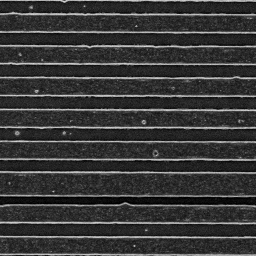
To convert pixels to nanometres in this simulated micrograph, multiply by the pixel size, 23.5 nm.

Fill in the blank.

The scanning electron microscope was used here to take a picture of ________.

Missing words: parallel lines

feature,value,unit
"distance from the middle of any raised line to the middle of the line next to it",748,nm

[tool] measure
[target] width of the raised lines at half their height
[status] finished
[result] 18.1 px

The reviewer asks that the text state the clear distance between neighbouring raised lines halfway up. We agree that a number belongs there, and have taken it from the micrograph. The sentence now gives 323 nm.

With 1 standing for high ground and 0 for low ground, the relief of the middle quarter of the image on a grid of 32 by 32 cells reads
00000000000000000000000000000000
00000000000000000000000000000000
00000000000000000000000000000000
00000000000000000000000000000000
11111111111111111111111111111111
11111111111111111111111111111111
11111111111111111111111111111111
11111111111111111111111111111111
00000000000000000000000000000000
00000000000000000000000000000000
00000000000000000000000000000000
00000000000000000000000000000000
11111111111111111111111111111111
11111111111111111111111111111111
11111111111111111111111111111111
11111111111111111111111111111111
00000000000000000000000000000000
00000000000000000000000000000000
00000000000000000000000000000000
11000100000000000000000000000000
11111111111111111111111111111111
11111111111111111111111111111111
11111111111111111111111111111111
11111111111111111111111111111111
00000000000000000000000000000000
00000000000000000000000000000000
00000000000000000000000000000000
11111111111111111111111111111111
11111111111111111111111111111111
11111111111111111111111111111111
11111111111111111111111111111111
11111111111111111111111111111111